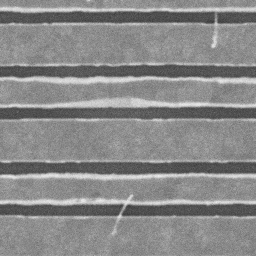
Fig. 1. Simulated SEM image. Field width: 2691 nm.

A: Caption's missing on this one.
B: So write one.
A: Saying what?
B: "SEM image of lines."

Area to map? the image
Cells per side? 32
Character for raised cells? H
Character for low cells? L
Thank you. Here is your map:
HHHHHHHHHHHHHHHHHHHHHHHHHHHHHHHH
LLLLLLLLLLLLLLLLLLLLLLLLLLLLLLLL
LLLLLLLLLLLLLLLLLLLLLLLLLLLLLLLL
HHHHHHHHHHHHHHHHHHHHHHHHHHHHHHHH
HHHHHHHHHHHHHHHHHHHHHHHHHHHHHHHH
HHHHHHHHHHHHHHHHHHHHHHHHHHHHHHHH
HHHHHHHHHHHHHHHHHHHHHHHHHHHHHHHH
HHHHHHHHHHHHHHHHHHHHHHHHHHHHHHHH
LLLLLLLLLLLLLLLLLLLLLLLLLLLLLLLL
LLLLLLLLLLLLLLLLLLLLLLLLLLLLLLLL
HHHHHHHHHHHHHHHHHHHHHHHHHHHHHHHH
HHHHHHHHHHHHHHHHHHHHHHHHHHHHHHHH
HHHHHHHHHHHHHHHHHHHHHHHHHHHHHHHH
LLLLLLLLLLLLLLLLLLLLLLLLLLLLLLLL
LLLLLLLLLLLLLLLLLLLLLLLLLLLLLLLL
HHHHHHHHHHHHHHHHHHHHHHHHHHHHHHHH
HHHHHHHHHHHHHHHHHHHHHHHHHHHHHHHH
HHHHHHHHHHHHHHHHHHHHHHHHHHHHHHHH
HHHHHHHHHHHHHHHHHHHHHHHHHHHHHHHH
HHHHHHHHHHHHHHHHHHHHHHHHHHHHHHHH
LLLLLLLLLLLLLLLLLLLLLLLLLLLLLLLL
LLLLLLLLLLLLLLLLLLLLLLLLLLLLLLLL
HHHHHHHHHHHHHHHHHHHHHHHHHHHHHHHH
HHHHHHHHHHHHHHHHHHHHHHHHHHHHHHHH
HHHHHHHHHHHHHHHHHHHHHHHHHHHHHHHH
LLLLLLLLLLLLLLLLLLLLLLLLLLLLLLLL
LLLLLLLLLLLLLLLLLLLLLLLLLLLLLLLL
HHHHHHHHHHHHHHHHHHHHHHHHHHHHHHHH
HHHHHHHHHHHHHHHHHHHHHHHHHHHHHHHH
HHHHHHHHHHHHHHHHHHHHHHHHHHHHHHHH
HHHHHHHHHHHHHHHHHHHHHHHHHHHHHHHH
HHHHHHHHHHHHHHHHHHHHHHHHHHHHHHHH